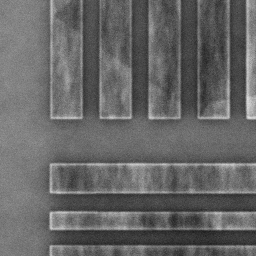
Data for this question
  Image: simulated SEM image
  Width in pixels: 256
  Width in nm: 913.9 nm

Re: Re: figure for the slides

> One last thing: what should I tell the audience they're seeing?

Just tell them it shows groups of lines, slits or small figures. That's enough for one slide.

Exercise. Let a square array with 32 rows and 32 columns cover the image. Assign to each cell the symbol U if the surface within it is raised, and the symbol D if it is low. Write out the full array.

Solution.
DDDDDDUUUUDDDUUUDDDUUUDDDUUUUDDU
DDDDDDUUUUDDDUUUDDDUUUDDDUUUUDDU
DDDDDDUUUUDDDUUUDDDUUUDDDUUUUDDU
DDDDDDUUUUDDDUUUDDDUUUDDDUUUUDDU
DDDDDDUUUUDDDUUUDDDUUUDDDUUUUDDU
DDDDDDUUUUDDDUUUDDDUUUDDDUUUUDDU
DDDDDDUUUUDDDUUUDDDUUUDDDUUUUDDU
DDDDDDUUUUDDDUUUDDDUUUDDDUUUUDDU
DDDDDDUUUUDDDUUUDDDUUUDDDUUUUDDU
DDDDDDUUUUDDDUUUDDDUUUDDDUUUUDDU
DDDDDDUUUUDDDUUUDDDUUUDDDUUUUDDU
DDDDDDUUUUDDDUUUDDDUUUDDDUUUUDDU
DDDDDDUUUUDDDUUUDDDUUUDDDUUUUDDU
DDDDDDUUUUDDDUUUDDDUUUDDDUUUUDDU
DDDDDDDUUUDDDUUUDDDUUUDDDUUUDDDU
DDDDDDDDDDDDDDDDDDDDDDDDDDDDDDDD
DDDDDDDDDDDDDDDDDDDDDDDDDDDDDDDD
DDDDDDDDDDDDDDDDDDDDDDDDDDDDDDDD
DDDDDDDDDDDDDDDDDDDDDDDDDDDDDDDD
DDDDDDDDDDDDDDDDDDDDDDDDDDDDDDDD
DDDDDDDDDDDDDDDDDDDDDDDDDDDDDDDD
DDDDDDUUUUUUUUUUUUUUUUUUUUUUUUUU
DDDDDDUUUUUUUUUUUUUUUUUUUUUUUUUU
DDDDDDUUUUUUUUUUUUUUUUUUUUUUUUUU
DDDDDDDDDDDDDDDDDDDDDDDDDDDDDDDD
DDDDDDDDDDDDDDDDDDDDDDDDDDDDDDDD
DDDDDDDDDDDDDDDDDDDDDDDDDDDDDDDD
DDDDDDUUUUUUUUUUUUUUUUUUUUUUUUUU
DDDDDDDUUUUUUUUUUUUUUUUUUUUUUUUU
DDDDDDDDDDDDDDDDDDDDDDDDDDDDDDDD
DDDDDDDDDDDDDDDDDDDDDDDDDDDDDDDD
DDDDDDUUUUUUUUUUUUUUUUUUUUUUUUUU